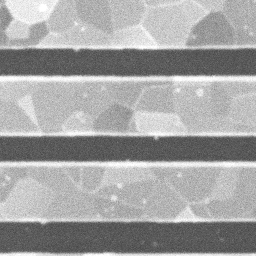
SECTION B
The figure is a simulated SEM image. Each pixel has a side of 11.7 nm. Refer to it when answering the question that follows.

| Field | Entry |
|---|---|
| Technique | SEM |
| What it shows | lines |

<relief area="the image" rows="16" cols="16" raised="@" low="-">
@@@@@@@@@@@@@@@@
@@@@@@@@@@@@@@@@
@@@@@@@@@@@@@@@@
----------------
----------------
@@@@@@@@@@@@@@@@
@@@@@@@@@@@@@@@@
@@@@@@@@@@@@@@@@
----------------
----------------
@@@@@@@@@@@@@@@@
@@@@@@@@@@@@@@@@
@@@@@@@@@@@@@@@@
@@@@@@@@@@@@@@@@
----------------
----------------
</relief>